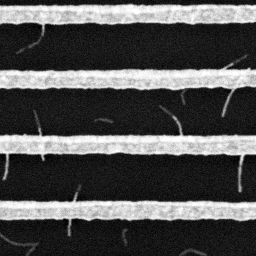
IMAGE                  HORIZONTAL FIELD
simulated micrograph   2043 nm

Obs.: lines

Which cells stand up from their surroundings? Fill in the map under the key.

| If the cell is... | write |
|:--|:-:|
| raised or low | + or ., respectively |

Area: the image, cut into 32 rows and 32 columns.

................................
++++++++++++++++++++++++++++++++
++++++++++++++++++++++++++++++++
................................
................................
................................
................................
................................
................................
++++++++++++++++++++++++++++++++
++++++++++++++++++++++++++++++++
................................
................................
................................
................................
................................
................................
++++++++++++++++++++++++++++++++
++++++++++++++++++++++++++++++++
..............................+.
................................
................................
................................
................................
................................
+++++.++++++++++++++++++++++....
++++++++++++++++++++++++++++++++
................................
................................
................................
................................
................................